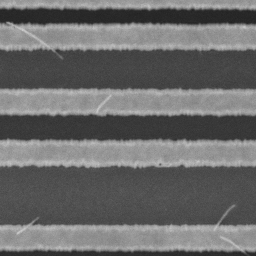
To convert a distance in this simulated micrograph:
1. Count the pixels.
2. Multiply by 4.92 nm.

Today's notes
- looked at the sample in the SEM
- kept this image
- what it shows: lines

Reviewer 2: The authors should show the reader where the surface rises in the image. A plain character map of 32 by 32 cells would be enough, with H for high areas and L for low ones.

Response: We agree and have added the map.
HHHHHHHHHHHHHHHHHHHHHHHHHHHHHHHH
LLLLLLLLLLLLLLLLLLLLLLLLLLLLLLLL
LLLLLLLLLLLLLLLLLLLLLLLLLLLLLLLL
HHHHHHHHHHHHHHHHHHHHHHHHHHHHHHHH
HHHHHHHHHHHHHHHHHHHHHHHHHHHHHHHH
HHHHHHHHHHHHHHHHHHHHHHHHHHHHHHHH
LLLLLLLLLLLLLLLLLLLLLLLLLLLLLLLL
LLLLLLLLLLLLLLLLLLLLLLLLLLLLLLLL
LLLLLLLLLLLLLLLLLLLLLLLLLLLLLLLL
LLLLLLLLLLLLLLLLLLLLLLLLLLLLLLLL
LLLLLLLLLLLLLLLLLLLLLLLLLLLLLLLL
HHHHHHHHHHHHHHHHHHHHHHHHHHHHHHHH
HHHHHHHHHHHHHHHHHHHHHHHHHHHHHHHH
HHHHHHHHHHHHHHHHHHHHHHHHHHHHHHHH
LLLLLLLLLLLLHLLLLHLLLHLLLLLHLLLL
LLLLLLLLLLLLLLLLLLLLLLLLLLLLLLLL
LLLLLLLLLLLLLLLLLLLLLLLLLLLLLLLL
HHLLHLHLLLHHLLLLLHHHLLLLLHLLLHLL
HHHHHHHHHHHHHHHHHHHHHHHHHHHHHHHH
HHHHHHHHHHHHHHHHHHHHHHHHHHHHHHHH
HHHHHHHHHHHHHHHHHHHHHHHHHHHHHHHH
LLLLLLLLLLLLLLLLLLLLLLLLLLLLLLLL
LLLLLLLLLLLLLLLLLLLLLLLLLLLLLLLL
LLLLLLLLLLLLLLLLLLLLLLLLLLLLLLLL
LLLLLLLLLLLLLLLLLLLLLLLLLLLLLLLL
LLLLLLLLLLLLLLLLLLLLLLLLLLLLLLLL
LLLLLLLLLLLLLLLLLLLLLLLLLLLLLLLL
LLLLLLLLLLLLLLLLLLLLLLLLLLLLLLLL
HHHHHHHHHHHHHHHHHHHHHHHHHHHHHHHH
HHHHHHHHHHHHHHHHHHHHHHHHHHHHHHHH
HHHHHHHHHHHHHHHHHHHHHHHHHHHHHHHH
LLLLLLLLLLLLLLLLLLLLLLLLLLLLHLHH